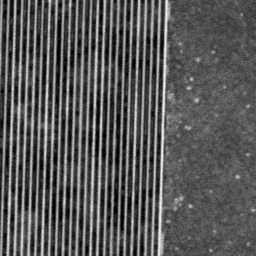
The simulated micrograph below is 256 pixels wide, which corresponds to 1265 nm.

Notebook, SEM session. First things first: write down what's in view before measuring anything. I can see parallel lines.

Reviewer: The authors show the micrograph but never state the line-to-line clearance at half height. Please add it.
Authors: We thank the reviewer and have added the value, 0.0272 microns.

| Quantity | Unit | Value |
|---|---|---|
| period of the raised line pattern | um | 0.034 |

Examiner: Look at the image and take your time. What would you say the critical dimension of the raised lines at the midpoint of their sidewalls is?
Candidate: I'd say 8.6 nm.